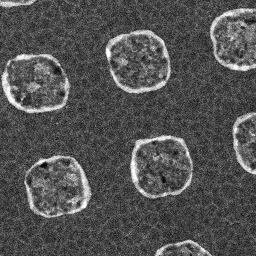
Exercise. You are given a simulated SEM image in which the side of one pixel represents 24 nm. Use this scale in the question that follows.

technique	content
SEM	raised bodies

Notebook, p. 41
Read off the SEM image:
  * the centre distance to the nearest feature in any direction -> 2540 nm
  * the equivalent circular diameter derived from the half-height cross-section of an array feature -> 61.6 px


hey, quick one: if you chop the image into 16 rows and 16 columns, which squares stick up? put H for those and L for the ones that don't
LLLLLLLLLLLLLLLL
LLLLLLLLLLLLLHHH
LLLLLLLHHHLLLHHH
LHHLLLLHHHLLLLHH
HHHHLLLHHHHLLLLL
HHHHLLLLHHLLLLLL
LHHHLLLLLLLLLLLL
LLLLLLLLLLLLLLLH
LLLLLLLLLLLLLLLH
LLLLLLLLHHHHLLLH
LLHHHLLLHHHHLLLH
LLHHHLLLLHHHLLLL
LLHHHLLLLLLLLLLL
LLLHLLLLLLLLLLLL
LLLLLLLLLLLLLLLL
LLLLLLLLLLHHHLLL